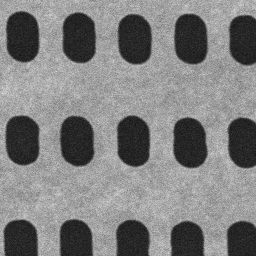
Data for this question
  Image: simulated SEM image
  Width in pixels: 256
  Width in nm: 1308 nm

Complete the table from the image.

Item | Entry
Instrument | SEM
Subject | a regular array of holes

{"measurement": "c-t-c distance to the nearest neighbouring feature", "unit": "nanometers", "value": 285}